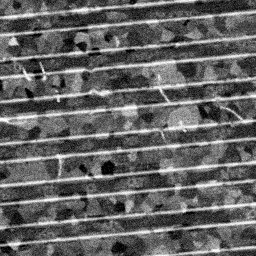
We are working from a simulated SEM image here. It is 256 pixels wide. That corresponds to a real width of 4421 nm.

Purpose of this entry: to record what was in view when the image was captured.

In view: parallel lines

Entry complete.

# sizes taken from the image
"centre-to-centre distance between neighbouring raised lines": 723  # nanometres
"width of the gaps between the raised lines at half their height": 297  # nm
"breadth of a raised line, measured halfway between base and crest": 421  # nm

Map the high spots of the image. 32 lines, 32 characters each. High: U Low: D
UUUUUUUUUUUUUUUUUUDDDDDDDDDDDDDD
UUUUUUUUDDDDDDDDDDDDDDDDDDDDDDDU
DDDDDDDDDDDDDDDDDDDDDDUUUUUUUUUU
DDDDDDDDDDDUUUUUUUUUUUUUUUUUUUUU
UUUUUUUUUUUUUUUUUUUUUUUUUUUUUUUU
UUUUUUUUUUUUUUUUUUUUUUDDDDDDDDDD
UUUUUUUUUUUDDDDDDDDDDDDDDDDDDDDD
DDDDDDDDDDDDDDDDDDDDDDDDUUUUUUUU
DDDDDDDDDDDDDUUUUUUUUUUUUUUUUUUU
DDUUUUUUUUUUUUUUUUUUUUUUUUUUUUUU
UUUUUUUUUUUUUUUUUUUUUUUUDDDDDDDD
UUUUUUUUUUUUUUDDDDDDDDDDDDDDDDDD
UUDDDDDDDDDDDDDDDDDDDDDDDDUUUUUU
DDDDDDDDDDDDDDDDDUUUUUUUUUUUUUUU
DDDDUUUUUUUUUUUUUUUUUUUUUUUUUUUU
UUUUUUUUUUUUUUUUUUUUUUUUUUUUDDDD
UUUUUUUUUUUUUUUUUDDDDDDDDDDDDDDD
UUUUUUDDDDDDDDDDDDDDDDDDDDDDDDUU
DDDDDDDDDDDDDDDDDDDUUUUUUUUUUUUU
DDDDDDDUUUUUUUUUUUUUUUUUUUUUUUUU
UUUUUUUUUUUUUUUUUUUUUUUUUUUUUUDD
UUUUUUUUUUUUUUUUUUUDDDDDDDDDDDDD
UUUUUUUUDDDDDDDDDDDDDDDDDDDDDDDD
DDDDDDDDDDDDDDDDDDDDDDUUUUUUUUUU
DDDDDDDDDDDUUUUUUUUUUUUUUUUUUUUU
DUUUUUUUUUUUUUUUUUUUUUUUUUUUUUUU
UUUUUUUUUUUUUUUUUUUUUDDDDDDDDDDD
UUUUUUUUUUDDDDDDDDDDDDDDDDDDDDDD
DDDDDDDDDDDDDDDDDDDDDDDUUUUUUUUU
DDDDDDDDDDDDUUUUUUUUUUUUUUUUUUUU
DDUUUUUUUUUUUUUUUUUUUUUUUUUUUUUU
UUUUUUUUUUUUUUUUUUUUUUUUUUDDDDDD